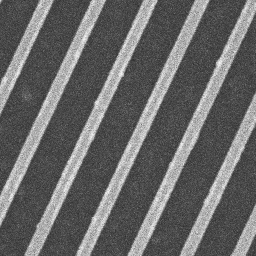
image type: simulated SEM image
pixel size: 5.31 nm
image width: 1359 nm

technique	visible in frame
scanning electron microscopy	parallel lines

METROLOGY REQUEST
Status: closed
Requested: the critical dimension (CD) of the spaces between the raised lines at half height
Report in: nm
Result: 184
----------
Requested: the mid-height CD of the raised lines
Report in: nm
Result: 64.8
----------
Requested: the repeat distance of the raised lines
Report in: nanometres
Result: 249